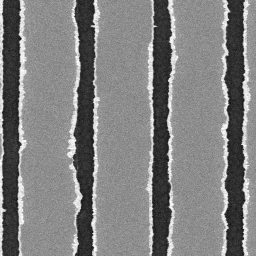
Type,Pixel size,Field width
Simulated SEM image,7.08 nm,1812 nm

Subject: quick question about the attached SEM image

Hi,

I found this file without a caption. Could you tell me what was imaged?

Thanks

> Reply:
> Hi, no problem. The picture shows one or a few lines or trenches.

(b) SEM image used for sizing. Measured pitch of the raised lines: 530 nm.